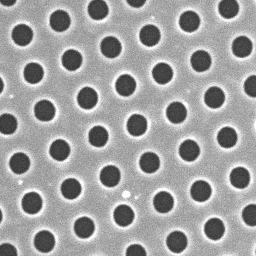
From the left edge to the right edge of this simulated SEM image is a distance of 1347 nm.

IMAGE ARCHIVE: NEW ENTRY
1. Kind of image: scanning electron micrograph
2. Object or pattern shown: a regular array of holes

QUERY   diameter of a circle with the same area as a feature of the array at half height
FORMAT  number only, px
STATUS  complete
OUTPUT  22.4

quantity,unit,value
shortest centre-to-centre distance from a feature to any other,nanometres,210